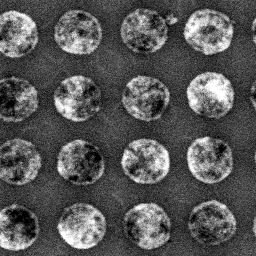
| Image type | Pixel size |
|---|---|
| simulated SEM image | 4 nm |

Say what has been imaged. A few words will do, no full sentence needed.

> a regular array of raised bodies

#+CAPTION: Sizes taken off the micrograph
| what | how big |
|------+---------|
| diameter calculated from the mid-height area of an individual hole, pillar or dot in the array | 0.173 um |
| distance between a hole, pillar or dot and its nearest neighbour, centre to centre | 255 nanometers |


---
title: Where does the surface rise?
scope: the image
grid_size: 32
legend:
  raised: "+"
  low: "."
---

................................
.................++......++.....
++++....++++....++++....++++....
++++...+++++...++++++..++++++...
++++...+++++...++++++..++++++...
++++...+++++....++++....++++....
+++.......+...............+.....
................................
................................
.........................++.....
+++.....++++....++++....+++++...
++++...+++++....+++++...+++++...
++++...+++++...++++++...+++++...
++++...+++++....+++++...+++++...
+++.....+++......+++......+.....
................................
................................
.........................++.....
++++....++++....++++....++++....
+++++..++++++...+++++...+++++...
+++++..++++++..++++++...+++++...
++++....+++++...+++++...+++++...
.+++.....+++.....+++......+.....
................................
................................
..........................+.....
++++....++++....++++....+++++...
++++....+++++...+++++...+++++...
+++++...+++++...+++++...+++++...
++++....+++++...+++++...+++++...
++++.....+++.....+++......+.....
................................